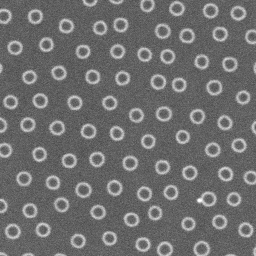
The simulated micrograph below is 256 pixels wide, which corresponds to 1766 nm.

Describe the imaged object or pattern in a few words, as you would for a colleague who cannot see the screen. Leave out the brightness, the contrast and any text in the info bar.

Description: a regular array of raised bodies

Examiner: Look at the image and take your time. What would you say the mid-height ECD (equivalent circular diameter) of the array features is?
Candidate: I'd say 12.8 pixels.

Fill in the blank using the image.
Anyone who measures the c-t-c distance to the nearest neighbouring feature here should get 185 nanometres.